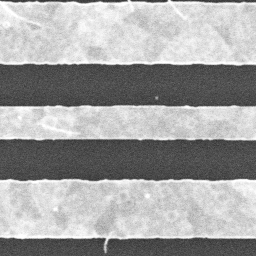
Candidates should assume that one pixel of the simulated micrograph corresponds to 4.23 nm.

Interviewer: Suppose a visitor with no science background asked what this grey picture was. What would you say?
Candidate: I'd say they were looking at lines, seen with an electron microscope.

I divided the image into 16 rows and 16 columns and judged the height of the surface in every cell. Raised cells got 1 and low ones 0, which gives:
1111111111111111
1111111111111111
1111111111111111
1111111111111111
0000000000000000
0000000000000000
0000000000000000
1111111111111111
1111111111111111
0000000000000000
0000000000000000
1111111111111111
1111111111111111
1111111111111111
1111111111111111
0000000000000000